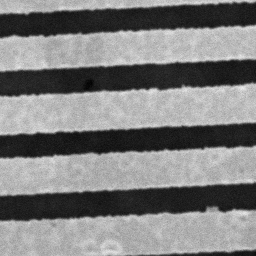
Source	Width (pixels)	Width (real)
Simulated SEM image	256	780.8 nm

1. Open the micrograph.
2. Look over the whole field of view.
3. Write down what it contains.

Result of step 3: lines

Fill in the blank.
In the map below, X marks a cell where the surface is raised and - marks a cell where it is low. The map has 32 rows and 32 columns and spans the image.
XXXXXXXXXXXXXXXXXXXXXXXXXX------
XXXX----------------------------
--------------------------------
---------------------------XXXXX
-------XXXXXXXXXXXXXXXXXXXXXXXXX
XXXXXXXXXXXXXXXXXXXXXXXXXXXXXXXX
XXXXXXXXXXXXXXXXXXXXXXXXXXXXXXXX
XXXXXXXXXXXXXXXXXXXXXXXXXXX-----
XXXXXXXX------------------------
--------------------------------
--------------------------------
------------XXXXXXXXXXXXXXXXXXXX
XXXXXXXXXXXXXXXXXXXXXXXXXXXXXXXX
XXXXXXXXXXXXXXXXXXXXXXXXXXXXXXXX
XXXXXXXXXXXXXXXXXXXXXXXXXXXXXXXX
XXXXXXXXXXXXXXXXXXXXXXXXXXXXX---
XXXXXXX-------------------------
--------------------------------
---------------------------X-XXX
-------XXXXXXXXXXXXXXXXXXXXXXXXX
XXXXXXXXXXXXXXXXXXXXXXXXXXXXXXXX
XXXXXXXXXXXXXXXXXXXXXXXXXXXXXXXX
XXXXXXXXXXXXXXXXXXXXXXXXXXXXXXXX
XXXXXXXXXXXXXXXXXX--------------
--------------------------------
--------------------------------
------------------------X--XXXXX
-------XXXXXXXXXXXXXXXXXXXXXXXXX
XXXXXXXXXXXXXXXXXXXXXXXXXXXXXXXX
XXXXXXXXXXXXXXXXXXXXXXXXXXXXXXXX
XXXXXXXXXXXXXXXXXXXXXXXXXXXXXXXX
XXXXXXXXXXXXXXXXXXXXXXXXX-------